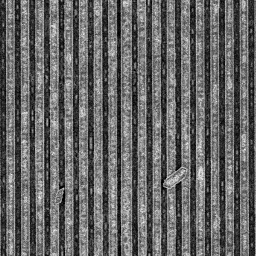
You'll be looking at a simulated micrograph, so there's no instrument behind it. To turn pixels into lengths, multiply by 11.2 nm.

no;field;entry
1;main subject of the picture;parallel lines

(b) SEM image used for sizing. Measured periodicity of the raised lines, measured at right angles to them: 0.164 micrometres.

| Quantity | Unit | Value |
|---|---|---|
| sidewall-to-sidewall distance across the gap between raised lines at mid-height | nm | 77.2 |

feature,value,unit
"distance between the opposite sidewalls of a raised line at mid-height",87.1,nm